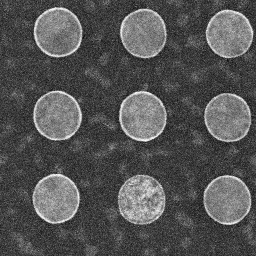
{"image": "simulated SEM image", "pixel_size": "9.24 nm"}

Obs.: a regular array of raised bodies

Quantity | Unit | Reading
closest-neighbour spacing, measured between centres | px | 82.9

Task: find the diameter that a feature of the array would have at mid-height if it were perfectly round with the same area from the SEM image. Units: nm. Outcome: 436